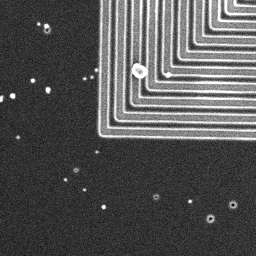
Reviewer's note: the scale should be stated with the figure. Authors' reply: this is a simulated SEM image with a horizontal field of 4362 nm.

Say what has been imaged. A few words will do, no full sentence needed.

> groups of lines, slits or small figures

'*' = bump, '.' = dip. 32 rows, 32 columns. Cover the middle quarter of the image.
*********..**..******..**..*****
*********..**..******..**.......
*********..**..******..**.*.....
*********..**..**..**..*********
*********..**..**..**..*********
*********..**..**..**...........
*********..**..**..***..........
*********..**..**..*************
*********..**..**...............
*********..**..**...............
*********..**..************.....
*********..**..*****************
*********..**...................
*********..**...................
*********..******************...
*********..*********************
*********.......................
*********.......................
***************************.....
********************************
********************************
********************************
********************************
********************************
********************************
********************************
********************************
********************************
********************************
********************************
********************************
********************************